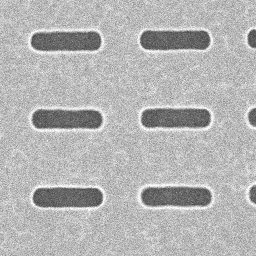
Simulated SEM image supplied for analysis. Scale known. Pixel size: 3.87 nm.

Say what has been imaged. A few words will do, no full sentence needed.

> holes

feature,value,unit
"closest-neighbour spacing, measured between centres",302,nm